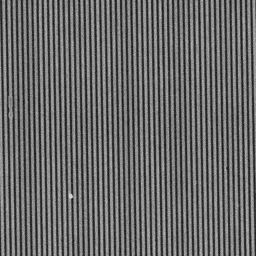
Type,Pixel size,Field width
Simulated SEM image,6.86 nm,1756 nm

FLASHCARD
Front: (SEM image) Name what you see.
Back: parallel lines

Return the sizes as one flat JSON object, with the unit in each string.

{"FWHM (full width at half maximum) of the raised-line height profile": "2.62 px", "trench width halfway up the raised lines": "0.018 um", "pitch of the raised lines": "0.0357 microns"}